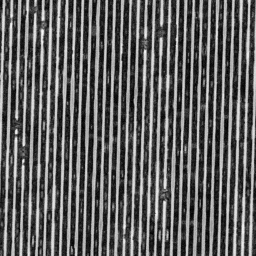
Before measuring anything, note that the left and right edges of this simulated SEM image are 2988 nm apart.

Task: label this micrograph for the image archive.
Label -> parallel lines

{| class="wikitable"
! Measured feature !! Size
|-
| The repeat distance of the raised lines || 0.0922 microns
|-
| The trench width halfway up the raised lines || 5.87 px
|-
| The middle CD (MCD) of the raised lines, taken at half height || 23.3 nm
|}